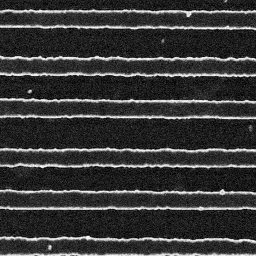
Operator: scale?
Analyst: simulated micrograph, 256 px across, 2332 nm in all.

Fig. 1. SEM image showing lines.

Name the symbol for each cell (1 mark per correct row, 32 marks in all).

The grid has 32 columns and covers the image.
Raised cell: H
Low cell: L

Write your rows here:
LLLLLLLLLLLLLLLLLLLLLLLLLLLLLLLL
HHHHHHHHHHHHHHHHHHHHHHHLHHHHHLHH
HHHHHHHHHHHHHHHHHHHHHHHHHHHHHHHH
LLLLLLLLLLLLLLLLHLLHLHHHHHHHHHHH
LLLLLLLLLLLLLLLLLLLLLLLLLLLLLLLL
LLLLLLLLLLLLLLLLLLLLLLLLLLLLLLLL
LLLLLLLLLLLLLLLLLLLLLLLLLLLLLLLL
HHHHHHHHHHHHHHHHHHHHHHHHHHHHHHHH
HHHHHHHHHHHHHHHHHHHHHHHHHHHHHHHH
LLLLLLLLLLLLLLLHHLHLLHHHHLLHHHHH
LLLLLLLLLLLLLLLLLLLLLLLLLLLLLLLL
LLLLLLLLLLLLLLLLLLLLLLLLLLLLLLLL
HHHHHHHHHHHHHHLLHLLLLLLLHLLLLLLL
HHHHHHHHHHHHHHHHHHHHHHHHHHHHHHHH
HHHHHHHHHHHHHHHHHHHHHHHHHHHHHHHH
LLLLLLLLLLLLLLLLLLLLLLLLLLLLLLLL
LLLLLLLLLLLLLLLLLLLLLLLLLLLLLLLL
LLLLLLLLLLLLLLLLLLLLLLLLLLLLLLLL
LLLLLLLLLLLLLLLLLLLLLLLLLLLLLLLL
HHHHHHHHHHHHHHHHHHHHHHHHHHHHHHHH
HHHHHHHHHHHHHHHHHHHHHHHHHHHHHHHH
LLLLLLLLLLLLLLLLLLLLLLLLLLLLLLLL
LLLLLLLLLLLLLLLLLLLLLLLLLLLLLLLL
LLLLLLLLLLLLLLLLLLLLLLLLLLLLLLLL
HHHHHHHHHHHHHHHHHHHHHHHHHHHHHHHH
HHHHHHHHHHHHHHHHHHHHHHHHHHHHHHHH
LLLLLLLLLLLLLLLLLLLLLLLLLLLLLLLL
LLLLLLLLLLLLLLLLLLLLLLLLLLLLLLLL
LLLLLLLLLLLLLLLLLLLLLLLLLLLLLLLL
LLLLLLLLLLLLLLLLLLLLLLLLLLLLLLLL
HHHHHHHHHHHHHHHHHHHHHHHHHHHHHHHH
HHHHHHHHHHHHHHHHHHHHHHHHHHHHHHHH